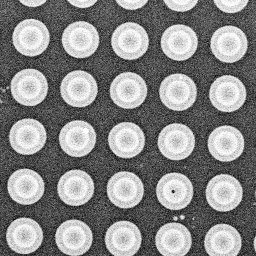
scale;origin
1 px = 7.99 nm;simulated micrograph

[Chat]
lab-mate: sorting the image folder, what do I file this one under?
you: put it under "an array of small figures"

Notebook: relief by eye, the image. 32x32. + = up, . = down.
...++....+++...+++...+++...++++.
............................++..
...++...........................
..++++..++++...+++...+++....++..
..++++..++++..++++..+++++..++++.
..++++..++++..++++..+++++.+++++.
...++...++++..++++...+++...++++.
......................+.....++..
................................
..+++...+++....++....++.....+...
.+++++..++++..++++..++++...+++..
.+++++..++++..++++..++++..+++++.
..+++...++++..++++..++++..+++++.
................+....++....+++..
................................
..+++...+++....++...............
.+++++..++++..++++..++++...+++..
.+++++.+++++..++++..++++..++++..
..+++...++++..++++..++++..++++..
.........+.....++....++....+++..
................................
..++....++......................
.++++..++++...+++...++++..++++..
.++++..+++++.+++++..++++..++++..
.++++..++++...++++..++++..++++..
...+.....+....+++...+++...++++..
................................
..++............................
.++++..++++...+++...+++...+++...
.++++..++++..+++++..++++..++++..
.++++..++++..+++++..++++..++++..
..++....+++...+++...+++...++++..